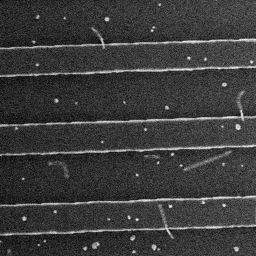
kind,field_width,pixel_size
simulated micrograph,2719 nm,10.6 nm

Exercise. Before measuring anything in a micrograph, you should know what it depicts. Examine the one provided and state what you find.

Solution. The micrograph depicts lines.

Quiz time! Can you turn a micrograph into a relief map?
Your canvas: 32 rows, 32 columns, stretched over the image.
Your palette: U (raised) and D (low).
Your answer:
DDDDDDDDDDDDDDDDDDDDDDDDDDDDDDDD
DDDDDDDDDDDDDDDDDDDDDDDDDDDDDDDD
DDDDDDDDDDDDDDDDDDDDDDDDDDDDDDDD
DDDDDDDDDDDDDDDDDDDDDDDDDDDDDDDD
DDDDDDDDDDDDDDDDDDDDDDDDDDDDDDDD
DDDDDDDDDDDDUDDDUUUUUUUUUUUUUUUU
UUUUUUUUUUUUUUUUUUUUUUUUUUUUUUUU
UUUUUUUUUUUUUUUUUUUUUUUUUUUUUUUU
UUUUUUUUUUUUUUUUUUUUUUUUUUUUUUDD
UUDDDDDDDDDDDDDDDDDDDDDDDDDDDDDD
DDDDDDDDDDDDDDDDDDDDDDDDDDDDDDDD
DDDDDDDDDDDDDDDDDDDDDDDDDDDDDDDD
DDDDDDDDDDDDDDDDDDDDDDDDDDDDDDDD
DDDDDDDDDDDDDDDDDDDDDDDDDDDDDDDD
DDDDDDDDDDDDDDDDDDDDDDDDDDDDDDUD
DDDDDDUUUUUUUUUUUUUUUUUUUUUUUUUU
UUUUUUUUUUUUUUUUUUUUUUUUUUUUUUUU
UUUUUUUUUUUUUUUUUUUUUUUUUUUUUUUU
UUUUUUUUUUUUUUUUUUUUUUUUUUDDDDDD
DDDDDDDDDDDDDDDDDDDDDDDDDDDDDDDD
DDDDDDDDDDDDDDDDDDDDDDDDDDDDDDDD
DDDDDDDDDDDDDDDDDDDDDDDDDDDDDDDD
DDDDDDDDDDDDDDDDDDDDDDDDDDDDDDDD
DDDDDDDDDDDDDDDDDDDDDDDDDDDDDDDD
DDDDDDDDDDDDDDDDDDDDDDDDDDDDDDDD
DDDDDUUUUUUUUUUUUUUUUUUUUUUUUUUU
UUUUUUUUUUUUUUUUUUUUUUUUUUUUUUUU
UUUUUUUUUUUUUUUUUUUUUUUUUUUUUUUU
UUUUUUUUUUUUUUUUUUUUUUUUDDDDDDDD
DDDDDDDDDDDDDDDDDDDDDDDDDDDDDDDD
DDDDDDDDDDDDDDDDDDDDDDDDDDDDDDDD
DDDDDDDDDDDDDDDDDDDDDDDDDDDDDDDD